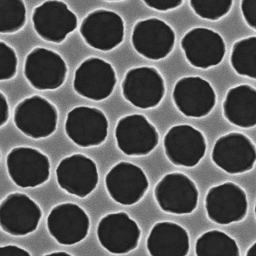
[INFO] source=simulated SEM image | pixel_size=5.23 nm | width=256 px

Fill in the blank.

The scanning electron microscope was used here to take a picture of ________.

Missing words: a regular array of holes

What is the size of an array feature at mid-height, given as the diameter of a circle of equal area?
214 nanometers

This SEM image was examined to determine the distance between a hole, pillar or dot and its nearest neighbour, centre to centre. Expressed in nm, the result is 258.